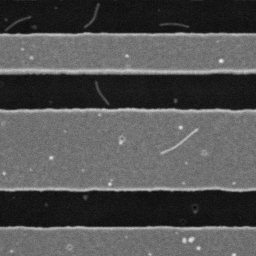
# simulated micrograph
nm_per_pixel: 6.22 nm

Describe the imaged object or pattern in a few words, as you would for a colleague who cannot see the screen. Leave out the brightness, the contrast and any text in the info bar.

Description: lines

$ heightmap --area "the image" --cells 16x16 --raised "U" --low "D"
DDDDDDDDDDDDDDDD
DDDDDDDDDDDDDDDD
UUUUUUUUUUUUUUUU
UUUUUUUUUUUUUUUU
UUUUUUUUUUUUUUUU
DDDDDDDDDDDDDDDD
DDDDDDDDDDDDDDDD
UUUUUUUUUUUUUUUU
UUUUUUUUUUUUUUUU
UUUUUUUUUUUUUUUU
UUUUUUUUUUUUUUUU
UUUUUUUUUUUUUUUU
DDDDDDDDDDDDDDDD
DDDDDDDDDDDDDDDD
UUUUUUUUUUUUUUUU
UUUUUUUUUUUUUUUU